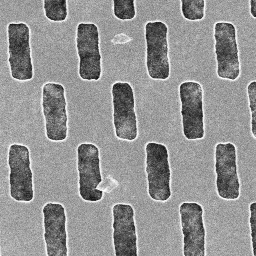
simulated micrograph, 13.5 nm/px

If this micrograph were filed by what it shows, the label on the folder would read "a regular array of holes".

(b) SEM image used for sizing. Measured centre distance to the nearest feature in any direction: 68.6 pixels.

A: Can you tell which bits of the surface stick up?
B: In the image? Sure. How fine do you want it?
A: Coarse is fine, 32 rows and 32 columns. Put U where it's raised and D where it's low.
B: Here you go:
UUUUUDDDUUUUUUDDDUUUUUUDDDUUUUUD
UUUUUUDDUUUUUUDDDUUUUUUDDDUUUUUD
UUUUUUDDUUUUUUUUUUUUUUUUUUUUUUUU
UDDDUUUUUUDDUUUUUUDDDUUUUUUDDUUU
UDDDUUUUUUDDUUUUUUDDDUUUUUUDDDUU
UDDDUUUUUUDDUUUUUUDDDUUUUUUDDDUU
UDDDUUUUUUDDUUUUUUDDDUUUUUUDDDUU
UDDDUUUUUUDDDUUUUUDDDUUUUUUDDDUU
UDDDUUUUUUDDDUUUUUDDDUUUUUUDDDUU
UUDDUUUUUUDDUUUUUUUDDUUUUUUDDDUU
UUUUUUDUUUUUUUDDUUUUUUUDDUUUUUUD
UUUUUDDDUUUUUUDDDUUUUUDDDUUUUUUD
UUUUUDDDUUUUUUDDDUUUUUUDDUUUUUUD
UUUUUDDDUUUUUUDDDUUUUUUDDUUUUUUD
UUUUUUDDUUUUUUDDDUUUUUUDDUUUUUUD
UUUUUUDDUUUUUUDDDUUUUUUDDUUUUUUD
UUUUUUDDUUUUUUDDDUUUUUUDDUUUUUUU
UUUUUUUDUUUUUUUUUUUUUUUUUUUUUUUU
UDDUUUUUUUDDUUUUUUDDDUUUUUUDDUUU
UDDDUUUUUUDDUUUUUUDDDUUUUUUDDDUU
UDDDUUUUUUDDDUUUUUDDDUUUUUUDDDUU
UDDDUUUUUUDDDUUUUUDDDUUUUUUDDDUU
UDDDUUUUUUDDDUUUUUUDDUUUUUUDDDUU
UDDDUUUUUUDDUUUUUUUDDUUUUUUDDDUU
UDDDUUUUUUDDDUUUUUUDDUUUUUUUDDUU
UUUUUUDUUUUUUUUUUUUUUUUDDUUUUUUU
UUUUUDDDUUUUUUDDDUUUUUUDDUUUUUUD
UUUUUDDDUUUUUUDDDUUUUUUDDUUUUUUD
UUUUUUDDUUUUUUDDDUUUUUUDDDUUUUUD
UUUUUUDDUUUUUUDDDUUUUUUDDDUUUUUD
UUUUUUDDUUUUUUDDDUUUUUUDDDUUUUUU
UUUUUUDDUUUUUUDDDUUUUUUDDDUUUUUU